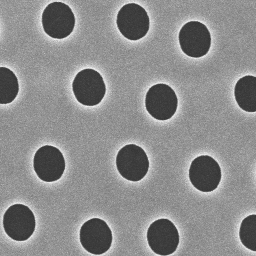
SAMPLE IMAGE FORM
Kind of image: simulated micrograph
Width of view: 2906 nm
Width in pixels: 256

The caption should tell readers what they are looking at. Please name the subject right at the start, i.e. a regular array of holes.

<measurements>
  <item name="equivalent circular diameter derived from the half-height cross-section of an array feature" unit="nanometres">398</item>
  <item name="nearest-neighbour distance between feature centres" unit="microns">0.762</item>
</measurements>